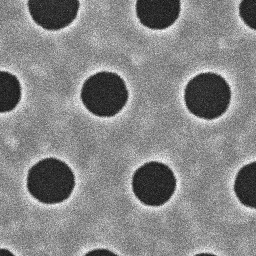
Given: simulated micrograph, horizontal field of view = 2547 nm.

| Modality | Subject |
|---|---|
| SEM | holes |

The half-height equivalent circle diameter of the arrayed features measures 475 nanometres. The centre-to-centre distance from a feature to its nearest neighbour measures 102 pixels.